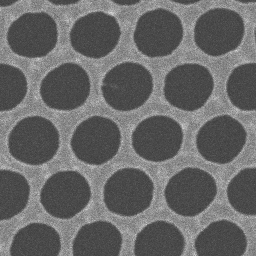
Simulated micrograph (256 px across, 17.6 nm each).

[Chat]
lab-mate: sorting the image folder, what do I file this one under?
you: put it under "a regular array of holes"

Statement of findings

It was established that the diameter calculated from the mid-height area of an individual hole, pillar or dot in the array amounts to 0.872 microns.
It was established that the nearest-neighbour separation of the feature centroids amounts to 1060 nanometers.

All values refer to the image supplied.